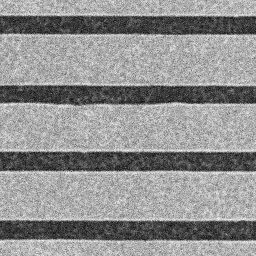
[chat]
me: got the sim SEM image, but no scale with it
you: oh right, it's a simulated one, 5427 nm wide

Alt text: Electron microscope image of one or a few lines or trenches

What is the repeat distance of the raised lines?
1.44 micrometres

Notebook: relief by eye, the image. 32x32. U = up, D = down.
UUUUUUUUUUUUUUUUUUUUUUUUUUUUUUUU
UUUUUUUUUUUUUUUUUUUUUUUUUUUUUUUU
DDDDDDDDDDDDDDDDDDDDDDDDDDDDDDDD
DDDDDDDDDDDDDDDDDDDDDDDDDDDDDDDD
UUUUUUUUUUUUUUUUUUUUUUUUUUUUUUUU
UUUUUUUUUUUUUUUUUUUUUUUUUUUUUUUU
UUUUUUUUUUUUUUUUUUUUUUUUUUUUUUUU
UUUUUUUUUUUUUUUUUUUUUUUUUUUUUUUU
UUUUUUUUUUUUUUUUUUUUUUUUUUUUUUUU
UUUUUUUUUUUUUUUUUUUUUUUUUUUUUUUU
UUUUUUUUUUUUUUUUUUUUUUUUUUUUUUUU
DDDDDDDDDDDDDDDDDDDDDDDDDDDDDDDD
DDDDDDDDDDDDDDDDDDDDDDDDDDDDDDDD
UUUUUUUUUUUUUUUUUUUUUUUUUUUUUUUU
UUUUUUUUUUUUUUUUUUUUUUUUUUUUUUUU
UUUUUUUUUUUUUUUUUUUUUUUUUUUUUUUU
UUUUUUUUUUUUUUUUUUUUUUUUUUUUUUUU
UUUUUUUUUUUUUUUUUUUUUUUUUUUUUUUU
UUUUUUUUUUUUUUUUUUUUUUUUUUUUUUUU
DDDDDDDDDDDDDDDDDDDDDDDDDDDDDDDD
DDDDDDDDDDDDDDDDDDDDDDDDDDDDDDDD
UUUUUUUUUUDUDDDDDDDDDDDDDDDDDDDD
UUUUUUUUUUUUUUUUUUUUUUUUUUUUUUUU
UUUUUUUUUUUUUUUUUUUUUUUUUUUUUUUU
UUUUUUUUUUUUUUUUUUUUUUUUUUUUUUUU
UUUUUUUUUUUUUUUUUUUUUUUUUUUUUUUU
UUUUUUUUUUUUUUUUUUUUUUUUUUUUUUUU
DDDDDDDDDDDDDDDDDDDDDDUUDDDDDUDD
DDDDDDDDDDDDDDDDDDDDDDDDDDDDDDDD
DDDDDDDDDDDDDDDDDDDDDDDDDDDDDDDD
UUUUUUUUUUUUUUUUUUUUUUUUUUUUUUUU
UUUUUUUUUUUUUUUUUUUUUUUUUUUUUUUU